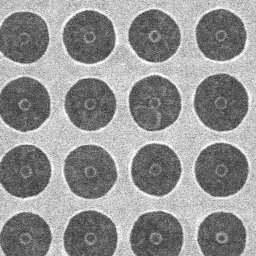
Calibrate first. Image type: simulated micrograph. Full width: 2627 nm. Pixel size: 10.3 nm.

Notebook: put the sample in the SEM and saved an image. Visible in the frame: a regular array of ring-shaped grooves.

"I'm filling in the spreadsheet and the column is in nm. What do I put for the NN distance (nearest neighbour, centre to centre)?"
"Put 671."